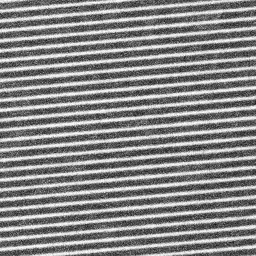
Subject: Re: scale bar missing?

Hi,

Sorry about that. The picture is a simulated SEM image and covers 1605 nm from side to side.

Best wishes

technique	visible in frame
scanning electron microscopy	parallel lines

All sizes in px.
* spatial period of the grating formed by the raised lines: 9.9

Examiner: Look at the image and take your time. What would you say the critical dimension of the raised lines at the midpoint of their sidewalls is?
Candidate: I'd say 1.87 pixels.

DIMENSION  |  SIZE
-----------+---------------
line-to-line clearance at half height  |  52.4 nm